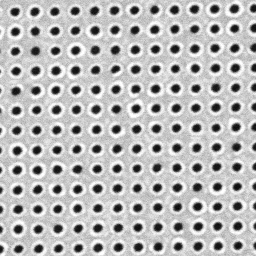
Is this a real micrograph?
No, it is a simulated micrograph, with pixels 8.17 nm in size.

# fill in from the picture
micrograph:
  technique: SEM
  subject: a regular array of holes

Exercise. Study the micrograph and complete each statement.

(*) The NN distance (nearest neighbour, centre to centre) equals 160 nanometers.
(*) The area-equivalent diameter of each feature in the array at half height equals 77.1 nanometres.